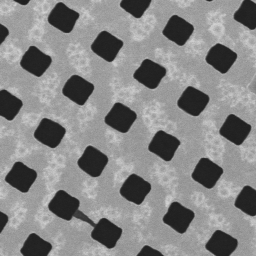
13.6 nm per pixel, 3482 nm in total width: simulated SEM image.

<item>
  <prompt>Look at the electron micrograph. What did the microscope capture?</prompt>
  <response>a regular array of holes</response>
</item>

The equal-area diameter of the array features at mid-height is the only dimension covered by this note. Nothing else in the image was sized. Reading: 384 nm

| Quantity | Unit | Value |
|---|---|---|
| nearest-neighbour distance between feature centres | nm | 694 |